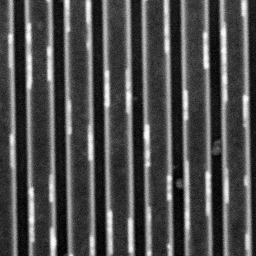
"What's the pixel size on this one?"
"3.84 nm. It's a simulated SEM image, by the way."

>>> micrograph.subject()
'parallel lines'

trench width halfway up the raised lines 55.1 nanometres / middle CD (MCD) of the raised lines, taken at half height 96.4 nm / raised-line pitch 150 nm